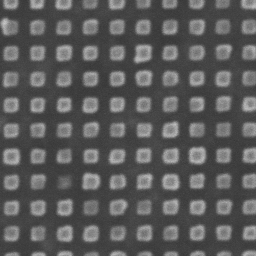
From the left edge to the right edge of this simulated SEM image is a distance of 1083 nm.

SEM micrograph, a regular array of raised bodies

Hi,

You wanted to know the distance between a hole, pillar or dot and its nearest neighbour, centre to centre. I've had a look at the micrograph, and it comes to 0.108 microns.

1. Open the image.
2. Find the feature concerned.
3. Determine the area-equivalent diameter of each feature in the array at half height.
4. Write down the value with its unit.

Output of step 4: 64.2 nm